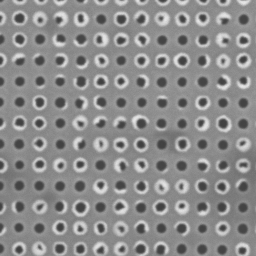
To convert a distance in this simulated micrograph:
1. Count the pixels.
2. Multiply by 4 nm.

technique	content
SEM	a regular array of holes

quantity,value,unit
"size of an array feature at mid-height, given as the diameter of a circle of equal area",37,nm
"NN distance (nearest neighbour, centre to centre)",80.2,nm